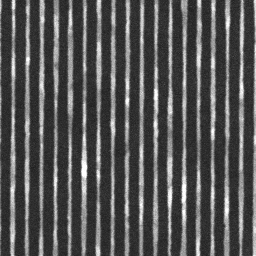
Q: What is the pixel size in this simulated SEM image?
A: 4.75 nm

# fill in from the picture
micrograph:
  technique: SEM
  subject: parallel lines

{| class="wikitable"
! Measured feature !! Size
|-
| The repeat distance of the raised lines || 0.0678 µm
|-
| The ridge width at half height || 13.1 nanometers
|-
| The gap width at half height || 55.9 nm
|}